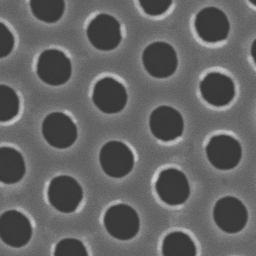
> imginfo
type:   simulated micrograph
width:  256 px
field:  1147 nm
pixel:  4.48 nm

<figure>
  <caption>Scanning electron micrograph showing a regular array of holes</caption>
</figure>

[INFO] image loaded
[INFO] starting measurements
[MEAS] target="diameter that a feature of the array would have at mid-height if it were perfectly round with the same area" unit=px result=35.7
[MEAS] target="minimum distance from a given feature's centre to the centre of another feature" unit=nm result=276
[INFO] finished